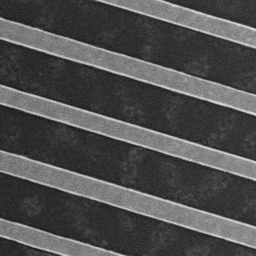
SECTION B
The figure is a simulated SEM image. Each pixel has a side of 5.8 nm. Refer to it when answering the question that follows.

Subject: one or a few lines or trenches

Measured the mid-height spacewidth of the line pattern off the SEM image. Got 260 nm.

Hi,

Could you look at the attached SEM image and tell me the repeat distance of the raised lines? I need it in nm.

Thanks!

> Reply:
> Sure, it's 368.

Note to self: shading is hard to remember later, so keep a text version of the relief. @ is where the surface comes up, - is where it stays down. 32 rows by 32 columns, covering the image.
--------------@@@@@@@-----------
-----------------@@@@@@@@-------
@-------------------@@@@@@@@----
@@@@--------------------@@@@@@@-
@@@@@@@@-------------------@@@@@
--@@@@@@@@@-------------------@@
------@@@@@@@@------------------
---------@@@@@@@@@--------------
------------@@@@@@@@@-----------
----------------@@@@@@@@--------
-------------------@@@@@@@@-----
@@@-------------------@@@@@@@@--
@@@@@@--------------------@@@@@@
--@@@@@@@--------------------@@@
-----@@@@@@@@-------------------
---------@@@@@@@----------------
------------@@@@@@@-------------
---------------@@@@@@@@---------
-------------------@@@@@@@------
@@--------------------@@@@@@@@--
@@@@@@-------------------@@@@@@@
@@@@@@@@@--------------------@@@
----@@@@@@@@--------------------
-------@@@@@@@@@----------------
-----------@@@@@@@@-------------
--------------@@@@@@@@----------
-----------------@@@@@@@@@------
--------------------@@@@@@@@@---
@@@@--------------------@@@@@@@@
@@@@@@@--------------------@@@@@
---@@@@@@@@-------------------@@
-------@@@@@@@------------------